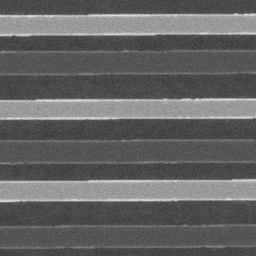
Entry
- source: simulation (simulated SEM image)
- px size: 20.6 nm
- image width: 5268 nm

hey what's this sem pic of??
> lines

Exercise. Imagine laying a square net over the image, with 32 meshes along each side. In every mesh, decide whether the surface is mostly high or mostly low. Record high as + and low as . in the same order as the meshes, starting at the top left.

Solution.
................................
................................
++++++++++++++++++++++++++++++++
++++++++++++++++++++++++++++++++
................................
................................
++++++++++++++++++++++++++++++++
++++++++++++++++++++++++++++++++
++++++++++++++++++++++++++++++++
................................
................................
................................
............................++++
++++++++++++++++++++++++++++++++
++++++++++++++++++++++++++++++++
................................
................................
................................
++++++++++++++++++++++++++++++++
++++++++++++++++++++++++++++++++
................................
................................
................................
++++++++++++++++++++++++++++++++
++++++++++++++++++++++++++++++++
................................
................................
................................
++++++++++++++++++++++++++++++++
++++++++++++++++++++++++++++++++
++++++++++++++++++++++++++++++++
................................